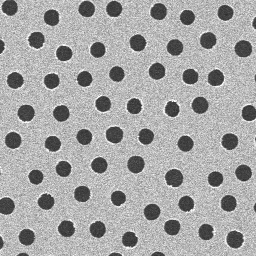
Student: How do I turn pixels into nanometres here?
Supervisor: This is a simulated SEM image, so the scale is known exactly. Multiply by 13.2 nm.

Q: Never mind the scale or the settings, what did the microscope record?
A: a regular array of holes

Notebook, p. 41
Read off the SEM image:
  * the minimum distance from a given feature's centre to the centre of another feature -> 393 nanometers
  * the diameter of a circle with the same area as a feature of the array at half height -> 217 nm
